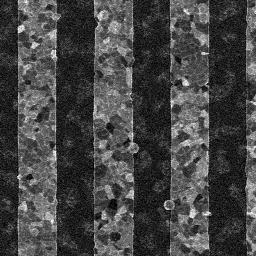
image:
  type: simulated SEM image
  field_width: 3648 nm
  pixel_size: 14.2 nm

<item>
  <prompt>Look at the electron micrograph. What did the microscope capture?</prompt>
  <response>one or a few lines or trenches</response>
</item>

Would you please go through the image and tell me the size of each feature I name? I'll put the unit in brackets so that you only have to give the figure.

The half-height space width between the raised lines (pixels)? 38.1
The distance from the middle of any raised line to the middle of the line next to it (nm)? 1090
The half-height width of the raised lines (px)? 37.6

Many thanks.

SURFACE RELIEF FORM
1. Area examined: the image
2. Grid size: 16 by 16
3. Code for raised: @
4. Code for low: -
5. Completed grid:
-@@@--@@---@@--@
-@@@--@@---@@--@
-@@---@@---@@--@
-@@---@@---@@--@
-@@---@@---@@--@
-@@---@@---@@--@
-@@---@@---@@--@
-@@---@@---@@--@
-@@@--@@---@@--@
-@@@--@@---@@--@
-@@@--@@---@@--@
-@@@--@@---@@--@
-@@@--@@--@@@--@
-@@---@@---@@--@
-@@---@@---@@--@
-@@@--@@---@@--@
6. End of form